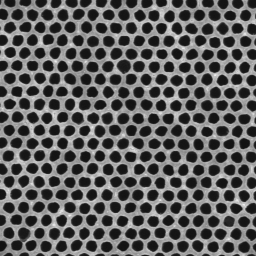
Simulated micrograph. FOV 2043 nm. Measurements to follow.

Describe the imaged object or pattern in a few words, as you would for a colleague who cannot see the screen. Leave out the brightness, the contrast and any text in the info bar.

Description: a regular array of holes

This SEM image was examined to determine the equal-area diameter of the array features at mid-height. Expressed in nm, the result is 89.6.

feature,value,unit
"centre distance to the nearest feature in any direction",114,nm